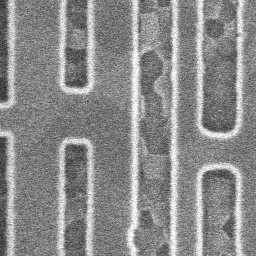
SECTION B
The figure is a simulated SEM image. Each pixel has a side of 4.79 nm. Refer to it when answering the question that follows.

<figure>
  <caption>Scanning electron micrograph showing one or a few lines or trenches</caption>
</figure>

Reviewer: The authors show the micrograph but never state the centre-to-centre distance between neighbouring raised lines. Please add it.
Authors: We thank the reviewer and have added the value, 0.361 µm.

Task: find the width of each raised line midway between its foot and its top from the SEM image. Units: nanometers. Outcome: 219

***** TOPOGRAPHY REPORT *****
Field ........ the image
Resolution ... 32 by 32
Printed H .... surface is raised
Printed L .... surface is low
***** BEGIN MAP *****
LHHHHHHHLLLHHHHHHLLLLLHHHLLLLLHH
LHHHHHHHLLLHHHHHHLLLLLHHHLLLLLHH
LHHHHHHHLLLHHHHHHLLLLLHHHLLLLLHH
LHHHHHHHLLLHHHHHHLLLLLHHHLLLLLHH
LHHHHHHHLLLHHHHHHLLLLLHHHLLLLLHH
LHHHHHHHLLLHHHHHHLLLLLHHHLLLLLHH
LHHHHHHHLLLHHHHHHLLLLLHHHLLLLLHH
LHHHHHHHLLLHHHHHHLLLLLHHHLLLLLHH
LHHHHHHHLLLHHHHHHLLLLLHHHLLLLLHH
LHHHHHHHLLLHHHHHHLLLLLHHHLLLLLHH
LHHHHHHHLLLHHHHHHLLLLLHHHLLLLLHH
LHHHHHHHHHHHHHHHHLLLLLHHHLLLLLHH
LHHHHHHHHHHHHHHHHLLLLLHHHLLLLLHH
HHHHHHHHHHHHHHHHHLLLLLHHHLLLLLHH
HHHHHHHHHHHHHHHHHLLLLLHHHLLLLLHH
HHHHHHHHHHHHHHHHHLLLLLHHHLLLLLHH
HHHHHHHHHHHHHHHHHLLLLLHHHHLLLHHH
LHHHHHHHHHHHHHHHHLLLLLHHHHHHHHHH
LHHHHHHHLLLHHHHHHLLLLLHHHHHHHHHH
LHHHHHHHLLLHHHHHHLLLLLHHHHHHHHHH
LHHHHHHHLLLHHHHHHLLLLLHHHHHHHHHH
LHHHHHHHLLLHHHHHHLLLLLHHHLLLLHHH
LHHHHHHHLLLHHHHHHLLLLLHHHLLLLLHH
LHHHHHHHLLLHHHHHHLLLLLHHHLLLLLHH
LHHHHHHHLLLHHHHHHLLLLLHHHLLLLLHH
LHHHHHHHLLLHHHHHHLLLLLHHHLLLLLHH
LHHHHHHHLLLHHHHHHLLLLHHHHLLLLLHH
LHHHHHHHLLLHHHHHHLLLLLHHHLLLLLHH
LHHHHHHHLLLHHHHHHLLLLLHHHLLLLLHH
LHHHHHHHLLLHHHHHLLLLLLHHHLLLLLHH
LHHHHHHHLLLHHHHHLLLLLLHHHLLLLLHH
LHHHHHHHLLLHHHHHHLLLLLHHHLLLLLHH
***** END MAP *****